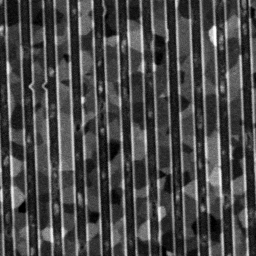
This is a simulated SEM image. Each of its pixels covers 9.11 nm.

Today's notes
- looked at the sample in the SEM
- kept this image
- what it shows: parallel lines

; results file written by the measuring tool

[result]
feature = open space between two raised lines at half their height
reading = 0.0945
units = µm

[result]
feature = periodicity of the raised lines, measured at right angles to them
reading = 222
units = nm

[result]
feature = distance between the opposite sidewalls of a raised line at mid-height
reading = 0.125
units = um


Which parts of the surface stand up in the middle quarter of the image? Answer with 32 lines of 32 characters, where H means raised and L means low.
HLLLHHHHLLHHHHLLHHHHLLHHHHLLLHHH
HLLLHHHHLLHHHHLLHHHHLLHHHHLLLHHH
HLLLHHHHLLHHHHLLLHHHLLLHHHLLLHHH
HLLLHHHHLLLHHHLLLHHHLLLHHHLLLHHH
HHLLHHHHLLLHHHLLLHHHLLLHHHLLLHHH
HHLLHHHHLLLHHHLLLHHHLLLHHHLLLHHH
HHLLHHHHLLLHHHLLLHHHLLLHHHLLLHHH
HHLLHHHHLLLHHHLLLHHHLLLHHHLLLHHH
HHLLHHHHLLLHHHLLLHHHLLLHHHLLLHHH
HHLLLHHHLLLHHHLLLHHHLLLHHHLLLHHH
HHLLLHHHLLLHHHLLLHHHLLLHHHLLLHHH
HHLLLHHHLLLHHHLLLHHHLLLHHHLLLHHH
HHLLLHHHLLLHHHLLLHHHLLLHHHLLLHHH
HHLLLHHHLLLHHHLLLHHHLLLHHHLLLHHH
HHLLLHHHLLLHHHLLLHHHLLLHHHLLLHHH
HHLLLHHHLLLHHHLLLHHHLLLHHHLLLHHH
HHLLLHHHLLLHHHLLLHHHLLLHHHLLLHHH
HHLLLHHHLLLHHHLLLHHHLLLHHHHLLHHH
HHLLLHHHLLLHHHLLLHHHLLLHHHHLLHHH
HHLLLHHHLLLHHHLLLHHHLLLHHHHLLHHH
HHLLLHHHLLLHHHLLLHHHLLLHHHHLLHHH
HHLLLHHHLLLHHHLLLHHHLLLHHHHLLHHH
HHLLLHHHLLLHHHLLLHHHLLLHHHHLLHHH
HHLLLHHHLLLHHHLLLHHHLLLHHHHLLLHH
HHLLLHHHLLLHHHHLLHHHHLLHHHHLLLHH
HHLLLHHHHLLHHHHLLHHHHLLHHHHLLLHH
HHLLLHHHHLLHHHHLLHHHHLLHHHHLLLHH
HHLLLHHHHLLHHHHLLHHHHLLHHHHLLLHH
HHLLLHHHHLLHHHHLLHHHHLLHHHHLLLHH
HHLLLHHHHLLHHHHLLLHHHLLLHHHLLLHH
HHLLLLHHHLLLHHHLLLHHHLLLHHHLLLHH
HHHLLLHHHLLLHHHLLLHHHLLLHHHLLLHH